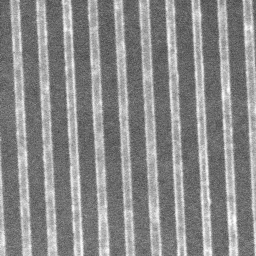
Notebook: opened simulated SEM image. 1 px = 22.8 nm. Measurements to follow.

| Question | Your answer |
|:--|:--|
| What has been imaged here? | parallel lines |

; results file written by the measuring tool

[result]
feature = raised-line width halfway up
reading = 168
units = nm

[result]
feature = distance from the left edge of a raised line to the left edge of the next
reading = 0.588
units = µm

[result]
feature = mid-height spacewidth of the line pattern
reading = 418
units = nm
